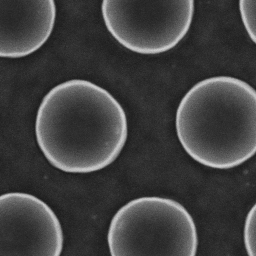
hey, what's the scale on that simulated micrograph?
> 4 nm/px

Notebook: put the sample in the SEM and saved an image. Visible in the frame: raised bodies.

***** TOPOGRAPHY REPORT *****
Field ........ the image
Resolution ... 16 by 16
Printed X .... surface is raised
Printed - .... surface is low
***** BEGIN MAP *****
XXX---XXXXXX---X
XXX----XXXXX---X
XXX----XXXX-----
----------------
----------------
----XX------XXX-
---XXXX----XXXXX
--XXXXXX---XXXXX
--XXXXXX---XXXXX
---XXXX-----XXXX
----XX----------
----------------
XX-------X------
XXX----XXXXX----
XXXX---XXXXX---X
XXXX---XXXXX---X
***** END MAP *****